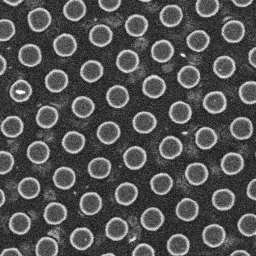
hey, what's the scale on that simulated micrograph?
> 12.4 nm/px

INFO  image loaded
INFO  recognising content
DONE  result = a regular array of raised bodies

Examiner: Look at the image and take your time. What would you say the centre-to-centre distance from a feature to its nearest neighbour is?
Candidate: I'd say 36.3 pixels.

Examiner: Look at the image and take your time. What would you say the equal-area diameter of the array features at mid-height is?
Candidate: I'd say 269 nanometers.